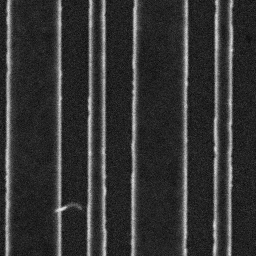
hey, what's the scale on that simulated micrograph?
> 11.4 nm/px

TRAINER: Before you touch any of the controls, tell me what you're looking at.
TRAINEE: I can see lines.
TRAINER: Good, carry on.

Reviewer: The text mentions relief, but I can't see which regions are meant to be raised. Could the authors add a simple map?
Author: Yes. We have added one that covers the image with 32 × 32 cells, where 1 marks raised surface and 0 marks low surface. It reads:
01111111000110000111111000011000
01111111000110000111111000011000
01111111000110000111111000011000
01111111000110000111111000011000
01111111000110000111111000011000
01111111000110000111111000011000
01111111000110000111111000011000
01111111000110000111111000011000
01111111000110000111111000011000
01111111000110000111111000011000
01111111000110000111111000011000
01111111000110000111111000011000
01111111000110000111111000011000
01111111000110000111111000011000
01111111000110000111111000011000
01111111000110000111111000011000
01111111000110000111111000011000
01111111000110000111111000011000
01111111000110000111111000011000
01111111000110000111111000011000
01111111000110000111111000011000
01111111000110000111111000011000
01111111000110000111111000011000
01111111000110000111111000011000
01111111000110000111111000011000
01111111000110000111111000011000
01111111000110000111111000011000
01111111000110000111111000011000
01111111000110000111111000011000
01111111000110000111111000011000
01111111000110000111111000011000
01111111000110000111111000011000